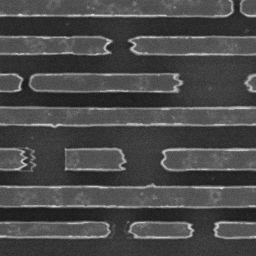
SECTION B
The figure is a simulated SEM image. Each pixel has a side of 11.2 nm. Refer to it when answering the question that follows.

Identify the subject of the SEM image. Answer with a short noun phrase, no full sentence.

parallel lines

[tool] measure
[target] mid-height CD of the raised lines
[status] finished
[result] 205 nanometres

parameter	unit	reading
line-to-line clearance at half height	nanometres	205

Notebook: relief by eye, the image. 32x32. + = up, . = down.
+++++++++++++++++++++++++++++.++
+++++++++++++++++++++++++++++.++
................................
................................
................................
++++++++++++++..++++++++++++++++
+++++++++++++....+++++++++++++++
................................
................................
++..++++++++++++++++++..........
+++.++++++++++++++++++.........+
.........++.........+...........
................................
+++++........................+++
++++++++++++++++++++++++++++++++
++++++++++++++++++++++++++++++++
................................
................................
................................
+++.....+++++++......+++++++++++
+++.....+++++++.....++++++++++++
................................
................................
++++++++++++++++++++++++++++++++
++++++++++++++++++++++++++++++++
++++++++++++++++++++++++++++++++
................................
................................
++++++++++++++..++++++++...+++++
+++++++++++++....+++++++...+++++
................................
................................